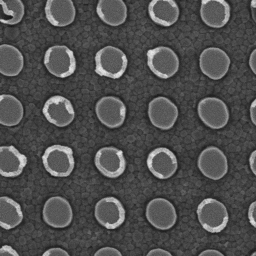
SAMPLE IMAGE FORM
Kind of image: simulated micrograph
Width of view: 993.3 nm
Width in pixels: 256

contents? a regular array of raised bodies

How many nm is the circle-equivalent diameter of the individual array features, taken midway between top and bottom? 119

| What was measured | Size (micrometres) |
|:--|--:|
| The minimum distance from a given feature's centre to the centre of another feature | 0.193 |